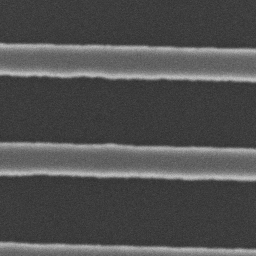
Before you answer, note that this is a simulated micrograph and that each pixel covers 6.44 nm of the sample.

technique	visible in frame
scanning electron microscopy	lines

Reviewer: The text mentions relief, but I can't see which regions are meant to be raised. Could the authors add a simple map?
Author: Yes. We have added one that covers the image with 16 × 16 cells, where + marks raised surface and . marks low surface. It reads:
................
................
................
++++++++++++++++
++++++++++++++++
................
................
................
................
++++++++++++++++
++++++++++++++++
................
................
................
................
+++++++++++.....